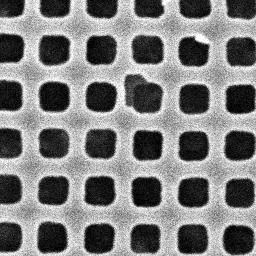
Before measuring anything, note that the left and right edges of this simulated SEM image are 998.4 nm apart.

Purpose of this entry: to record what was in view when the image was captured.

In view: a regular array of holes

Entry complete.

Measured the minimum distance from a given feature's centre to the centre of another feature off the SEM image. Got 181 nanometres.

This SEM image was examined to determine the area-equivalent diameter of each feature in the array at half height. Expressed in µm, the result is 0.128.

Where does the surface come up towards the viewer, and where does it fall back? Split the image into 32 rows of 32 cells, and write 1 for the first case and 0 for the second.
00011000011000011000110000110000
00011000011000011000010000110000
11111111111111111111111111111111
11111111111111111111111111111111
00111000111100111011111111111111
00011000011000010000110000110000
00011000011000111000110000110000
00011000011000111000110000110000
11111111111111111111111111111111
11111111111111110011111111111111
00011000111000110000111001111111
00011000011000010000110000110000
00011000011000010000110000110000
00111000111000110000110000110000
11111111111111111111111111111111
11111111111111111111111111111111
00111000111000111000111001111001
00011000011000011000110000110000
00011000011000111000110000110000
00111000111000111000110000110000
11111111111111111111111111111111
11111111111111111111111111111111
00011000011000111000111000111001
00011000011000110000110000110000
00011000111000010000110000110000
00111000111000111000111000110000
11111111111111111111111111111111
11111111111111111111111111111111
00011000111000111000110000110001
00011000110000110000110000110000
00011000110000110000110000110000
00111001111000111001110000110001